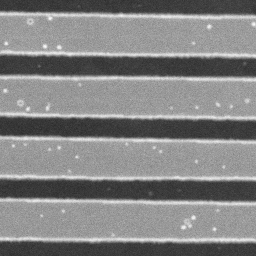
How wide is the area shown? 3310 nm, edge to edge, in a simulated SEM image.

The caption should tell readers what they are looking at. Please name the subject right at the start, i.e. lines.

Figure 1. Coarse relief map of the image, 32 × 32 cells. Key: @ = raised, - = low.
--------------------------------
--------------------------------
@@@@@@@@@@@@@@@@@@@@@@@@@@@@@@@@
@@@@@@@@@@@@@@@@@@@@@@@@@@@@@@@@
@@@@@@@@@@@@@@@@@@@@@@@@@@@@@@@@
@@@@@@@@@@@@@@@@@@@@@@@@@@@@@@@@
@@@@@@@@@@@@@@@@@@@@@@@@@@@@@@@@
--------------------------------
--------------------------------
-@@-----------------------------
@@@@@@@@@@@@@@@@@@@@@@@@@@@@@@@@
@@@@@@@@@@@@@@@@@@@@@@@@@@@@@@@@
@@@@@@@@@@@@@@@@@@@@@@@@@@@@@@@@
@@@@@@@@@@@@@@@@@@@@@@@@@@@@@@@@
---@@@@@@@@@@@@@@@@@@@@@@@@@@@@@
--------------------------------
--------------------------------
@@@@@@@@@@@@@@@@@@@@@@----------
@@@@@@@@@@@@@@@@@@@@@@@@@@@@@@@@
@@@@@@@@@@@@@@@@@@@@@@@@@@@@@@@@
@@@@@@@@@@@@@@@@@@@@@@@@@@@@@@@@
@@@@@@@@@@@@@@@@@@@@@@@@@@@@@@@@
--------------------------------
--------------------------------
--------------------------------
@@@@@@@@@@@@@@@@@@@@@@@@@@@@@@@@
@@@@@@@@@@@@@@@@@@@@@@@@@@@@@@@@
@@@@@@@@@@@@@@@@@@@@@@@@@@@@@@@@
@@@@@@@@@@@@@@@@@@@@@@@@@@@@@@@@
@@@@@@@@@@@@@@@@@@@@@@@@@@@@@@@@
--------------------------------
--------------------------------